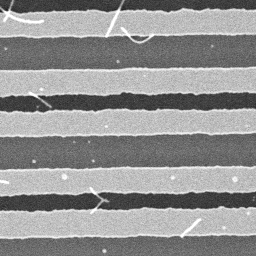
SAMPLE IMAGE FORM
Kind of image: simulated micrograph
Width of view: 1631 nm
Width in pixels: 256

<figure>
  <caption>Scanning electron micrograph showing lines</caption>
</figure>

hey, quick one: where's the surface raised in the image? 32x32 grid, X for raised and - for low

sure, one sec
--------------------------------
-X----XXXXXXX-XXXXXXXXXXXXXXXXXX
XXXXXXXXXXXXXXXXXXXXXXXXXXXXXXXX
XXXXXXXXXXXXXXXXXXXXXXXXXXXXXXXX
XX-XXXXX-XX--X----X-------------
--------------------------------
--------------------------------
--------------------------------
-------------------------------X
XXXXXXXXXXXXXXXXXXXXXXXXXXXXXXXX
XXXXXXXXXXXXXXXXXXXXXXXXXXXXXXXX
XXXXXXXXXXXXXXXXXXXXXXXXXXXX-X-X
--------------------------------
--------------------------------
XXXXXXXXXXXXXXXXXXXXXXXXXXXXXXXX
XXXXXXXXXXXXXXXXXXXXXXXXXXXXXXXX
XXXXXXXXXXXXXXXXXXXXXXXXXXXXXXXX
--------------------------------
--------------------------------
--------------------------------
--------------------------------
XXXXXXXXXXXXXXXXXXXXXXXXXXXXXXXX
XXXXXXXXXXXXXXXXXXXXXXXXXXXXXXXX
XXXXXXXXXXXXXXXXXXXXXXXXXXXXXXXX
--------------------------------
--------------------------------
XXXXXXXXXXXXXXXXXXXXXXXXXXXXXXXX
XXXXXXXXXXXXXXXXXXXXXXXXXXXXXXXX
XXXXXXXXXXXXXXXXXXXXXXXXXXXXXXXX
XXXXXXXXXXXXXXXXX--XXXX---------
--------------------------------
--------------------------------